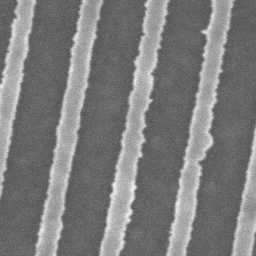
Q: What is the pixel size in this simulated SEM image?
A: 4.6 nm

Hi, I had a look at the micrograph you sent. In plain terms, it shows one or a few lines or trenches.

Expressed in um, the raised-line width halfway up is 0.0842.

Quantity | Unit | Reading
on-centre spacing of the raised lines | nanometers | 296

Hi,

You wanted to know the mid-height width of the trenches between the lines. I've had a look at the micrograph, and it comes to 210 nanometres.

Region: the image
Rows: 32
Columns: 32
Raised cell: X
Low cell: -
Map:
--XX------XXX-----XXX------XX---
--XX------XX------XXX------XX---
--XX------XX------XXX-----XXX---
--XX------XX------XX------XXX---
--X------XXX------XX------XX----
-XX------XXX------XX------XX----
-XX------XX------XXX------XX----
-XX------XX------XXX------XX----
-XX------XX------XX------XXX----
XXX------XX------XX------XX-----
XXX-----XXX------XX------XX-----
XX------XXX------XX------XX-----
XX------XX------XXX------XX-----
XX------XX------XX------XX------
XX------XX------XX------XX------
X------XXX------XX------XX------
X------XXX------XX------XX------
X------XXX-----XXX------XXX-----
X------XX------XXX-----XXX------
X------XX------XX------XXX-----X
X------XX------XX------XX------X
------XXX------XX------XX------X
------XX------XXX------XX------X
------XX------XXX-----XXX------X
------XX------XXX-----XX------XX
------XX------XX------XX------XX
------XX------XX------XX------XX
-----XXX-----XXX------XX------XX
-----XXX-----XXX-----XXX------XX
-----XX------XX------XXX-----XXX
-----XX------XX------XX------XXX
----XXX------XX------XX------XX-